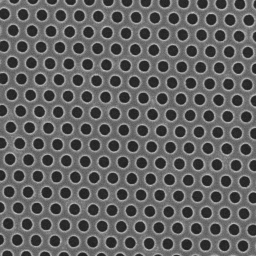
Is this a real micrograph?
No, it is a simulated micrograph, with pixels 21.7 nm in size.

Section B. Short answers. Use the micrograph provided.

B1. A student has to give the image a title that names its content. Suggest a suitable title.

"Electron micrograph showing a regular array of holes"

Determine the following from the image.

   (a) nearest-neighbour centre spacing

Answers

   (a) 18.4 pixels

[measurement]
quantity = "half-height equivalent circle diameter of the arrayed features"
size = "246 nm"